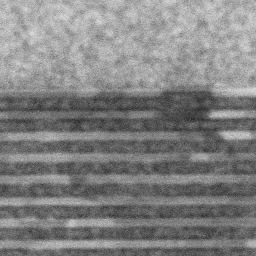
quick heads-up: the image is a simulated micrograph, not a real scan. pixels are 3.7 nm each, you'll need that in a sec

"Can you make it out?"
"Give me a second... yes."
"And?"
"parallel lines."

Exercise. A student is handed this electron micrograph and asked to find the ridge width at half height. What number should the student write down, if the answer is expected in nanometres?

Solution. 23.1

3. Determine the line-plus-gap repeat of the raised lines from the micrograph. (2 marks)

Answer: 79.7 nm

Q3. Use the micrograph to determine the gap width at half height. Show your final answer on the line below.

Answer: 56.4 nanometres